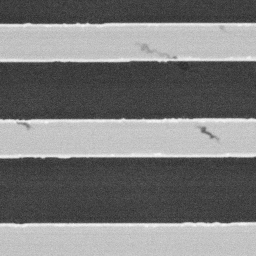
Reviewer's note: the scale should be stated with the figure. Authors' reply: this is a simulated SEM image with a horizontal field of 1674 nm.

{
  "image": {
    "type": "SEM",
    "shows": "lines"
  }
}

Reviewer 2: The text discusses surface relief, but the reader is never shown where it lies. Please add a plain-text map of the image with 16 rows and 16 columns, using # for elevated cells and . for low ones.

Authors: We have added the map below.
................
.#...###########
################
################
................
................
................
..........######
################
################
................
................
................
................
################
################